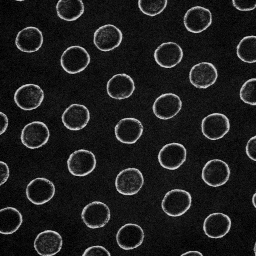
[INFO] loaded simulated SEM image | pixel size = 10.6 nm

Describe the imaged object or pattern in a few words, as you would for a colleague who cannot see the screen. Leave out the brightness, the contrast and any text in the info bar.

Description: a regular array of raised bodies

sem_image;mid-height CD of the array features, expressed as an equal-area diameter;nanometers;277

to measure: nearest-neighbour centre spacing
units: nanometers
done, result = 480